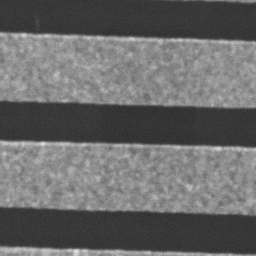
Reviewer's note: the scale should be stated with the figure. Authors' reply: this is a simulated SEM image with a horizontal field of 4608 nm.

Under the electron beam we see lines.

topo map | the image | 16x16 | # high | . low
................
................
#############...
################
################
################
.......#########
................
................
################
################
################
################
................
................
###.............